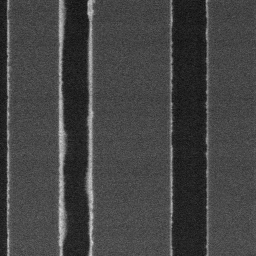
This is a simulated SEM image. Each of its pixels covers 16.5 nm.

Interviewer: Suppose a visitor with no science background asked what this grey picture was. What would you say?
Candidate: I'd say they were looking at lines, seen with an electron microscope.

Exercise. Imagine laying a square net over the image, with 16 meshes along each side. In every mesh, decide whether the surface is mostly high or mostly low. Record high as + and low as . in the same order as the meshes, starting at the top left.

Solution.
++++.++++++..+++
++++..+++++..+++
++++..+++++..+++
++++..+++++..+++
++++..+++++..+++
++++..+++++..+++
++++..+++++..+++
++++..+++++..+++
++++..+++++..+++
++++..+++++..+++
++++..+++++..+++
++++..+++++..+++
++++..+++++..+++
++++..+++++..+++
++++..+++++..+++
++++..+++++..+++